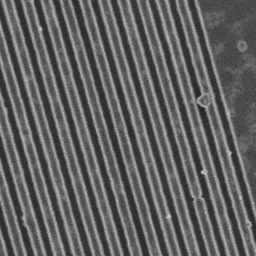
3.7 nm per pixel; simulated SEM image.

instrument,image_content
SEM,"parallel lines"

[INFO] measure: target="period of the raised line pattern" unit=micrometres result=0.0686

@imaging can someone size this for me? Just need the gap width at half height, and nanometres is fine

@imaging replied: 29.4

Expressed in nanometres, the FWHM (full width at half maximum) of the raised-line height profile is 40.1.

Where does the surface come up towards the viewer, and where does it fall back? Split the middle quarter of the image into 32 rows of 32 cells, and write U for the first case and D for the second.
UDDDUUDDUUUDDUUUDDUUUDDUUUDDUUDD
UUDDUUUDDUUDDDUUDDUUUDDUUUDDUUUD
UUDDUUUDDUUUDDUUDDDUUDDUUUDDUUUD
UUDDDUUDDUUUDDUUUDDUUUDDUUDDUUUD
UUUDDUUDDDUUDDUUUDDUUUDDUUUDDUUU
UUUDDUUUDDUUUDDUUDDUUUDDUUUDDUUU
DUUDDUUUDDUUUDDUUUDDUUDDUUUDDUUU
DUUDDDUUDDDUUDDUUUDDUUUDDUUUDDUU
DUUUDDUUUDDUUDDDUUDDUUUDDUUUDDUU
DUUUDDUUUDDUUUDDUUUDUUUDDUUUDDUU
DDUUDDUUUDDUUUDDUUUDDUUDDDUUDDDU
DDUUUDDUUDDUUUDDUUUDDUUUDDUUUDDU
DDUUUDDUUUDDUUUDDUUDDDUUDDUUUDDU
DDDUUDDUUUDDUUUDDUUDDDUUDDDUUDDU
UDDUUDDUUUDDUUUDDUUUDDUUUDDUUDDD
UDDUUUDDUUDDDUUDDUUUDDUUUDDUUUDD
UDDUUUDDUUUDDUUUDDUUDDDUUDDUUUDD
UDDUUUDDUUUDDUUUDDUUUDDUUDDDUUDD
UUDDUUDDDUUDDUUUDDUUUDDUUUDDUUUD
UUDDUUUDDUUUDDUUDDDUUDDUUUDDUUUD
UUDDUUUDDUUUDDUUUDDUUDDDUUDDDUUD
UUUDDUUDDUUUDDUUUDDUUUDDUUUDDUUD
UUUDDUUUDDUUDDDUUDDUUUDDUUUDDUUU
UUUDDUUUDDUUUDDUUDDDUUDDDUUDDUUU
DUUDDUUUDDUUUDDUUUDDUUUDDUUDDDUU
DUUUDDUUDDDUUDDUUUDDUUUDDUUUDDUU
DUUUDDUUUDDUUUDDUUDDDUUDDUUUDDUU
DDUUDDUUUDDUUUDDUUUDDUUDDDUUDDUU
DDUUDDUUUDDDUUDDUUUDDUUUDDUUDDDU
DDUUUDDUUUDDUUDDDUUDDUUUDDUUUDDU
DDUUUDDUUUDDUUUDDUUUDDUUDDDUUDDU
DDDUUDDDUUDDUUUDDUUUDDUUDDDUUDDU